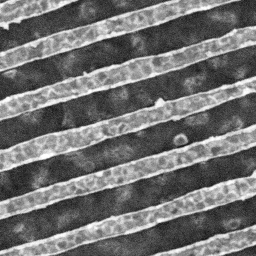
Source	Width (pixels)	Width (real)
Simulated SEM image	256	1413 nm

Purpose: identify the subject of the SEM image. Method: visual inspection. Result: parallel lines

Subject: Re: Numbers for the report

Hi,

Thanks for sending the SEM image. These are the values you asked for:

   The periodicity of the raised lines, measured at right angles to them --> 264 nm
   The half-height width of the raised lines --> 18.1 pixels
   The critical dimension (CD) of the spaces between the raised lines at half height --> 164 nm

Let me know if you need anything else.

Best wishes